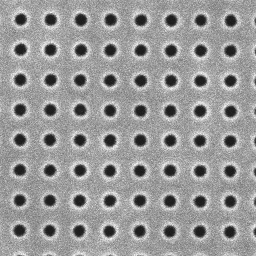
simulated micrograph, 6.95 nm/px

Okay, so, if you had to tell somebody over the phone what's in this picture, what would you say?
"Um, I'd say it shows a regular array of holes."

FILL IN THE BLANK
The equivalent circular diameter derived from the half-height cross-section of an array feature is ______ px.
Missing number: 12.3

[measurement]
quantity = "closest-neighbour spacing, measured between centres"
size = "0.207 micrometres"